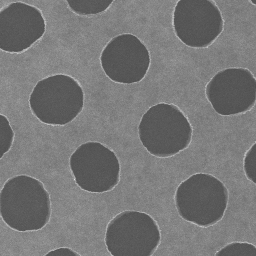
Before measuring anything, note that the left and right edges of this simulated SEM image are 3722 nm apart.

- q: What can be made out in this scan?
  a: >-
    holes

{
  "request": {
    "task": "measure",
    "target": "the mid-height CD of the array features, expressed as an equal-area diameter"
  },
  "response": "742 nanometers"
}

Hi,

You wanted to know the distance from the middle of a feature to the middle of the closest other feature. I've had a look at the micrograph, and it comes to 1140 nanometres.